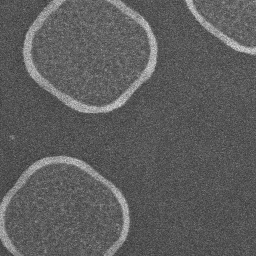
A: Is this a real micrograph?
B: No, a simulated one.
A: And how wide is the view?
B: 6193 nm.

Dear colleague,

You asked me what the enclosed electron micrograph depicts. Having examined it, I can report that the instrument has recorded raised bodies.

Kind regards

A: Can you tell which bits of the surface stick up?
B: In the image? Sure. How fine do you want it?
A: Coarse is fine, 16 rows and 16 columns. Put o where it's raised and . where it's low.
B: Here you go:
...ooooo....oooo
..ooooooo....ooo
..ooooooo.....oo
..oooooooo......
..ooooooo.......
...ooooo........
.....oo.........
................
................
................
..ooo...........
.oooooo.........
oooooooo........
oooooooo........
oooooooo........
.oooooo.........